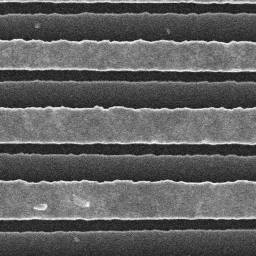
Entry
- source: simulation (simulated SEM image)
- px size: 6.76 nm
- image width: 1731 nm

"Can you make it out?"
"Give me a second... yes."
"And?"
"lines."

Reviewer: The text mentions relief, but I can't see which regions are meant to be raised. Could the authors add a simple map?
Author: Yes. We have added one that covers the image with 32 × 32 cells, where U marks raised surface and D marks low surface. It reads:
DDDDDDDDDDDDDDDDDDDDDDDDDDDDDDDD
DDDDDDDDDDDDDDDDDDDDDDDDDDDDDDDD
DDDDDDDDDDDDDDDDDDDDDDDDDDDDDDDD
DDDDDDDDDDDDDDDDDDDDDDDDDDDDDDDD
DDDDDDDDDDDDDDDDDDDDDDDDDDDDDDDD
UUUUUUUUUUUUUUUUUUUUUUUUUUUUUUUU
UUUUUUUUUUUUUUUUUUUUUUUUUUUUUUUU
UUUUUUUUUUUUUUUUUUUUUUUUUUUUUUUU
UUUUUUUUUUUUUUUUUUUUUUUUUUUUUUUU
DDDDDDDDDDDDDDDDDDDDDDDDDDDDDDDD
DDDDDDDDDDDDDDDDDDDDDDDDDDDDDDDD
DDDDDDDDDDDDDDDDDDDDDDDDDDDDDDDD
DDDDDDDDDDDDDDDDDDDDDDDDDDDDDDDD
UDDDUDUUUDDUUDUUDDDDDDDDDDUDDDDD
UUUUUUUUUUUUUUUUUUUUUUUUUUUUUUUU
UUUUUUUUUUUUUUUUUUUUUUUUUUUUUUUU
UUUUUUUUUUUUUUUUUUUUUUUUUUUUUUUU
UUUUUUUUUUUUUUUUUUUUUUUUUUUUUUUU
DDDDDDDDDDDDDDDDDDDDDDDDDDDDDDDD
DDDDDDDDDDDDDDDDDDDDDDDDDDDDDDDD
DDDDDDDDDDDDDDDDDDDDDDDDDDDDDDDD
DDDDDDDDDDDDDDDDDDDDDDDDDDDDDDDD
DDDDDDDDDDDDDDDDDDDDDDDDDDDDDDDD
UUUUUUUUUUUUUUUUUUUUUUUUUUUUUUUU
UUUUUUUUUUUUUUUUUUUUUUUUUUUUUUUU
UUUUUUUUUUUUUUUUUUUUUUUUUUUUUUUU
UUUUUUUUUUUUUUUUUUUUUUUUUUUUUUUU
DDDDDDDDDDDDDDDDDDDDDDDDDDDDDDDD
DDDDDDDDDDDDDDDDDDDDDDDDDDDDDDDD
DDDDDDDDDDDDDDDDDDDDDDDDDDDDDDDD
DDDDDDDDDDDDDDDDDDDDDDDDDDDDDDDD
DDDDDDDDDDDDDDDDDDDDDDDDDDDDDDDD